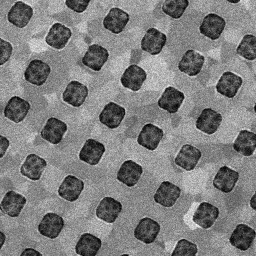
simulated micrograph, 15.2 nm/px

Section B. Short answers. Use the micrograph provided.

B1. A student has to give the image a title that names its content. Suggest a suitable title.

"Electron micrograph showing a regular array of holes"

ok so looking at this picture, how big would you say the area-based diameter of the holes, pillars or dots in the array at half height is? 389 nanometers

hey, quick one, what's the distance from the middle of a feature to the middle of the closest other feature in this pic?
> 41.8 pixels